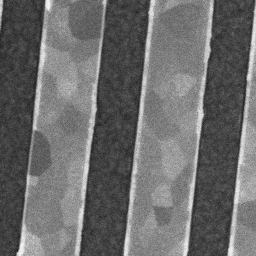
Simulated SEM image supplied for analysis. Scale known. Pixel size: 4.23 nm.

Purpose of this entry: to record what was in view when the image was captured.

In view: one or a few lines or trenches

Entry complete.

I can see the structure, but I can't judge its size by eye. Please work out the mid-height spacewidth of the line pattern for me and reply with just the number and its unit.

184 nm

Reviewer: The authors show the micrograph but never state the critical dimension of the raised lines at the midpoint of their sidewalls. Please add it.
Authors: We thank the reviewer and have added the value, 258 nm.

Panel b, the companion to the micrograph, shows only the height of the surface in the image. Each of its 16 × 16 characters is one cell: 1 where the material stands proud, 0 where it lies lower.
0001111001111000
0001110001111000
0001110001111000
0001110001111000
0011110001111000
0011110001111001
0011110001111001
0011110001111001
0011110001110001
0011110011110001
0011100011110001
0011100011110001
0011100011110001
0111100011110001
0111100011110011
0111100011110011